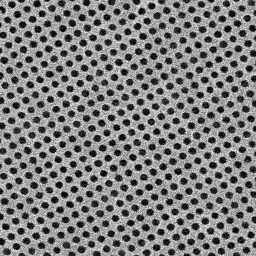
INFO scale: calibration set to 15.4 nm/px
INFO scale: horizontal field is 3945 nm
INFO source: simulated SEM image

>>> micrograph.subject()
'a regular array of holes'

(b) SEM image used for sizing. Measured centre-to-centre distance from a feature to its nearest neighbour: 11 px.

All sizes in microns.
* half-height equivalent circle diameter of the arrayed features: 0.12